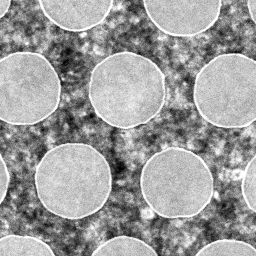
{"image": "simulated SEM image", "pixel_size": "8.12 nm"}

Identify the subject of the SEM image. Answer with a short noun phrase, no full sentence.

raised bodies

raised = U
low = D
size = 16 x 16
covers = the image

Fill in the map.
DDDUUUUDDUUUUUDD
DDDDUUDDDDUUUDDD
DDDDDDDDDDDDDDDD
DUUDDDDUUDDDDDUD
UUUDDDUUUUDDDUUU
UUUUDDUUUUDDUUUU
UUUUDDUUUUDDUUUU
UUUDDDDUUDDDDUUU
DDDDDDDDDDDDDDDD
DDDUUUDDDDUUDDDD
DDUUUUUDDUUUUDDU
DDUUUUUDDUUUUDDU
DDDUUUUDDUUUUDDU
DDDDUDDDDDUUDDDD
DDDDDDDDDDDDDDDD
UUUDDDUUUDDDDUUU